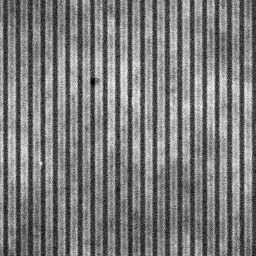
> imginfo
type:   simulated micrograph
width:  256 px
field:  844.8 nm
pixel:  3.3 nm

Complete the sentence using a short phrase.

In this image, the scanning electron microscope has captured parallel lines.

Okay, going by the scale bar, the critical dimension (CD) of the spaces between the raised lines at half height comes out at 17.3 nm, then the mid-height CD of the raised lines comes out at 23.1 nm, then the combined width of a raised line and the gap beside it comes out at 41.1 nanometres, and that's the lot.